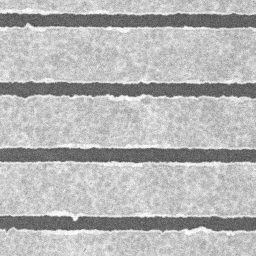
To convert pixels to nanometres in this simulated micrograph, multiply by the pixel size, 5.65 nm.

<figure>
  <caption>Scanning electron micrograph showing one or a few lines or trenches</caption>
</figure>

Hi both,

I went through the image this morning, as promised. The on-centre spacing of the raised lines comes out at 66.3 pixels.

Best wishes